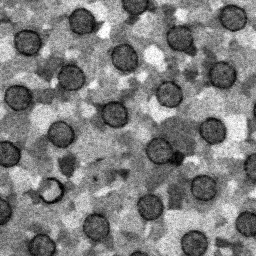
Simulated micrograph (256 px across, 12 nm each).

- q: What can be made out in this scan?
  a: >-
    a regular array of holes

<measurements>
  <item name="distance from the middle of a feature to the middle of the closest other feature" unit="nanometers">682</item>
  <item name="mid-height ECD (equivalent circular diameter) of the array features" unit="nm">341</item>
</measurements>